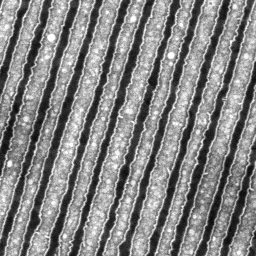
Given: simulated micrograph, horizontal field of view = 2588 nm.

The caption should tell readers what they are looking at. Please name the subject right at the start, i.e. parallel lines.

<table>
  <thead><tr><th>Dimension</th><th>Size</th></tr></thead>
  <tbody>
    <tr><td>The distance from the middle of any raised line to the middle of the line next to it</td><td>0.243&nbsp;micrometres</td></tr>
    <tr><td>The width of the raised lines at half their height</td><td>94.4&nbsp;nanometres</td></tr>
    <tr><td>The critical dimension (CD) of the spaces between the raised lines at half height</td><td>145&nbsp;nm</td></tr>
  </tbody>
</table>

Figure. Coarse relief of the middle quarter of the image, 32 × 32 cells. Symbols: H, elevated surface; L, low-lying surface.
LLLHHLLLLHHHLLLHHHLLLLHHLLLLHHLL
LLHHHLLLLHHHLLLHHHLLLLHHLLLHHHLL
LLHHHLLLLHHLLLHHHLLLLLHHLLLHHHLL
LLHHLLLLLHHLLLHHHLLLLHHHLLLHHLLL
LHHHLLLLHHHLLLHHHLLLLHHHLLLHHLLL
LHHHLLLLHHLLLLHHLLLLLHHLLLHHHLLL
LHHLLLLLHHLLLHHHLLLLHHHLLLHHHLLL
HHHLLLLLHHLLLHHHLLLLHHHLLLHHLLLL
HHHLLLLHHLLLLHHLLLLLHHLLLLHHLLLL
HHHLLLLHHLLLHHHHLLLLHHLLLHHHLLLL
HHLLLLLHHLLLHHHLLLLHHHLLLHHLLLLH
HHLLLLHHHLLLHHLLHLLHHHLLLHHLLLLH
HHLLLLHHLLLHHHLLLLHHHLLLHHLLLLLH
HLLLLHHHLLLHHHLLLLHHHLLLHHLLLLLH
HLLLLHHLLLLHHLLLLLHHLLLHHHLLLLLH
HLLLLHHLLLLHHLLLLHHHLLLHHHLLLLHH
LLLLHHHLLLHHHLLLLHHHLLLHHLLLLLHH
LLLLHHHLLLHHHLLLLHHLLLLHHLLLLHHH
LLLLHHLLLLHHLLLLLHHLLLHHHLLLLHHH
LLLLHHLLLHHHLLLLHHHLLLHHHLLLLHHL
LLLHHHLLLHHHLLLLHHHLLLHHLLLLLHHL
LLLHHHLLLHHLLLLLHHLLLLHHLLLLLHHL
LLLHHLLLLHHLLLLHHHLLLHHHLLLLHHHL
LLLHHLLLHHHLLLLHHHLLLHHLLLLLHHLL
LLHHHLLLHHLLLLLHHLLLLHHLLLLLHHLL
LLHHLLLLHHLLLLHHHLLLHHHLLLLHHLLL
LLHHLLLHHLLLLLHHHLLLHHLLLLLHHLLL
LHHHLLLHHLLLLLHHLLLLHHLLLLHHHLLL
LHHLLLLHHLLLLLHHLLLHHHLLLLHHHLLL
LHHLLLLHHLLLLHHHLHLHHLLLLLHHHLLH
LHHLLLHHLLLLLHHLLLLHHLLLLLHHLLLH
LHHLLLHHLLLLLHHLLLLHHLLLLHHHLLLH